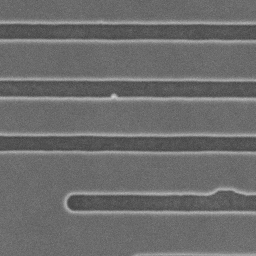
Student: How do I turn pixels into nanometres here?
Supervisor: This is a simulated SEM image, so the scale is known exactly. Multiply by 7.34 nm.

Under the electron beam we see parallel lines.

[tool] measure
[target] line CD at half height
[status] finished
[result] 295 nanometres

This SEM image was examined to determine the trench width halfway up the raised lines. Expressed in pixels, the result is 16.3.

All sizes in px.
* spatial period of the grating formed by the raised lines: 56.5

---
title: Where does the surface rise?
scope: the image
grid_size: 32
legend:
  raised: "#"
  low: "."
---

################################
################################
################################
................................
................................
################################
################################
################################
################################
################################
................................
................................
################################
################################
################################
################################
################################
................................
................................
################################
################################
################################
################################
################################
#########.......................
########........................
###################..#.....####.
################################
################################
################################
################################
################################